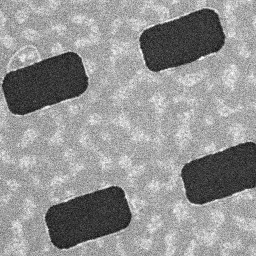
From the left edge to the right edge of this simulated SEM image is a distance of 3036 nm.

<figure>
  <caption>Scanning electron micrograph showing holes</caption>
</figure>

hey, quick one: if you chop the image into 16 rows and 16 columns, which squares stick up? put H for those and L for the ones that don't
HHHHHHHHHHHHHHHH
HHHHHHHHHHLLLLHH
HHHHHHHHHLLLLLHH
HHHLLHHHHLLLLHHH
HLLLLHHHHHHHHHHH
LLLLLHHHHHHHHHHH
LLLLHHHHHHHHHHHH
HHHHHHHHHHHHHHHH
HHHHHHHHHHHHHHHH
HHHHHHHHHHHHHHLL
HHHHHHHHHHHLLLLL
HHHHHHHHHHHLLLLL
HHHHLLLLHHHHLLHH
HHHLLLLLHHHHHHHH
HHHLLLLHHHHHHHHH
HHHHHHHHHHHHHHHH